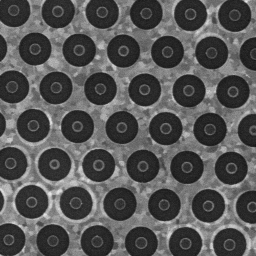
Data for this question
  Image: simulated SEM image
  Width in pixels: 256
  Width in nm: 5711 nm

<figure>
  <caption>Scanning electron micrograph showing an array of small figures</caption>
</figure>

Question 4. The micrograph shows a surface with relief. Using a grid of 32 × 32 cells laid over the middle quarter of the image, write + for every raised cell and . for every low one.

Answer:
++...++++++++....++++++.....++++
++++++++++++++++++++++++++++++++
.++++++....++++++++..+++++++++++
.+++++......+++++......++++++...
..+++........++++.......++++....
..+++........+++........+++.....
..+++........+++.........++.....
..+++........+++........+++.....
.+++++.......++++.......+++.....
+++++++.....+++++.......++++....
+++++++++++++++++++...++++++++..
++..++++++++++++++++++++++++++++
+.....++++++.....++++++.....++++
.......++++.......++++.......+++
.......++++.......++++.......+++
........++.........++.........++
.......+++.........++.........++
.......+++........+++........+++
.......++++.......++++.......+++
++...+++++++.....++++++.....++++
++++++++++++++++++++++++++++++++
+++++++....++++++++..+++++++++++
.++++.......+++++......+++++....
..+++.......++++.......++++.....
..++.........+++........+++.....
..++.........++.........++......
..++.........+++........+++.....
..+++.......++++........+++.....
.++++......++++++......+++++....
+++++++..+++++++++...+++++++....
+....+++++++++++++++++++++++++++
......++++++....+++++++....+++++